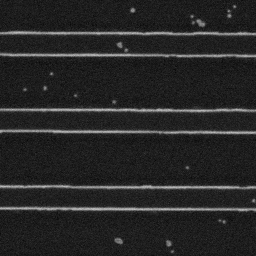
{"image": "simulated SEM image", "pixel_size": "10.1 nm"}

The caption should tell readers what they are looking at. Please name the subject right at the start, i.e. lines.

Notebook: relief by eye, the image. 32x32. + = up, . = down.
................................
................................
................................
................................
++++++++++++++++++++++++++++++++
++++++++++++++++++++++++++++++++
++++++++++++++++++++++++++++++++
................................
................................
................................
................................
................................
................................
................................
++++++++++++++++++++++++++++++++
++++++++++++++++++++++++++++++++
..........+...++++++++++++++++++
................................
................................
................................
................................
................................
................................
++++++++++++++++++++++++++++++++
++++++++++++++++++++++++++++++++
++++++++++++++++++++++++++++++++
................................
................................
................................
................................
................................
................................